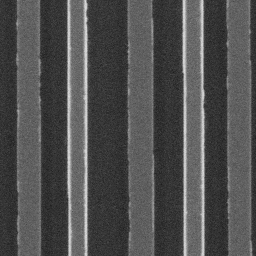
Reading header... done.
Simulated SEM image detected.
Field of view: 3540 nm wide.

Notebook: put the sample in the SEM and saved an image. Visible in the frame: lines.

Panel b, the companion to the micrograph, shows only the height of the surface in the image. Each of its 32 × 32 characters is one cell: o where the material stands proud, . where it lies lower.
..ooo....oo.....ooo....oo...ooo.
..ooo....oo.....ooo....oo...ooo.
..ooo....oo.....ooo....oo...ooo.
..ooo....oo.....ooo....oo...ooo.
..ooo....oo.....ooo....oo....oo.
..ooo....oo.....ooo....oo...ooo.
..ooo....oo.....ooo....oo....oo.
..ooo....oo.....ooo....oo....oo.
..ooo....oo.....ooo....oo....oo.
..ooo....oo.....ooo....oo...ooo.
..ooo....oo.....ooo....oo...ooo.
..ooo....oo.....ooo....oo....oo.
..ooo....oo.....ooo....oo....oo.
..ooo....oo.....ooo....oo....oo.
..ooo....oo.....ooo....oo....oo.
..ooo....oo.....ooo....oo....oo.
..ooo....oo.....ooo....oo....oo.
..ooo....oo.....ooo....oo....oo.
..ooo....oo.....ooo....oo....oo.
..ooo....oo.....ooo....oo....oo.
..ooo....oo.....ooo....oo....oo.
..ooo....oo.....ooo....oo....oo.
..ooo....oo.....ooo....oo....oo.
..ooo....oo.....ooo....oo....oo.
..ooo....oo.....ooo....oo....oo.
..ooo....oo.....ooo....oo....oo.
..ooo....oo.....ooo....oo....oo.
..ooo....oo.....ooo....oo....oo.
..ooo....oo.....ooo....oo....oo.
..ooo....oo.....ooo....oo....oo.
..ooo....oo.....ooo....oo....oo.
..ooo....oo.....ooo....oo....oo.